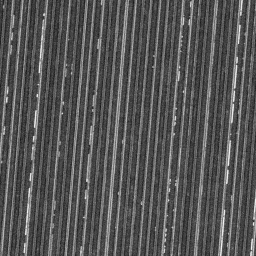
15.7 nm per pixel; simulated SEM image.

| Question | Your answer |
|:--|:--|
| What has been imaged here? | parallel lines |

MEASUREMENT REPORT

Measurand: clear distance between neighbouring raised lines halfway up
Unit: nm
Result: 97.6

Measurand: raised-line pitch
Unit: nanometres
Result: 127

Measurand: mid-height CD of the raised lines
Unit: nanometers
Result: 37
